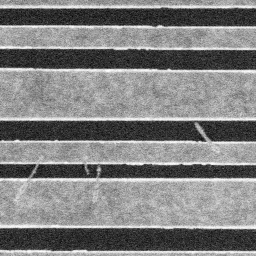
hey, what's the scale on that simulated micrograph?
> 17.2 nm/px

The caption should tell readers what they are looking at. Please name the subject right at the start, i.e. lines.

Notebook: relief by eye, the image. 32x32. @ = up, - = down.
@@@@@@@@@@@@@@@@@@@@@@@@@@@@@@@@
--------------------------------
--------------------------------
@@@@@@@@@@@@@@@@@@@@@@@@@@@@@@@@
@@@@@@@@@@@@@@@@@@@@@@@@@@@@@@@@
@@@@@@@@@@@@@@@@@@@@@@@@@@@@@@@@
--------------------------------
--------------------------------
--------------------------------
@@@@@@@@@@@@@@@@@@@@@@@@@@@@@@@@
@@@@@@@@@@@@@@@@@@@@@@@@@@@@@@@@
@@@@@@@@@@@@@@@@@@@@@@@@@@@@@@@@
@@@@@@@@@@@@@@@@@@@@@@@@@@@@@@@@
@@@@@@@@@@@@@@@@@@@@@@@@@@@@@@@@
@@@@@@@@@@@@@@@@@@@@@@@@@@@@@@@@
--------------------------------
--------------------------------
--------------------------------
@@@@@@@@@@@@@@@@@@@@@@@@@@@@@@@@
@@@@@@@@@@@@@@@@@@@@@@@@@@@@@@@@
----@-----@-----@@--@@@@-@@@@@@@
--------------------------------
@@@@@@@@-@@-@@@---@-------------
@@@@@@@@@@@@@@@@@@@@@@@@@@@@@@@@
@@@@@@@@@@@@@@@@@@@@@@@@@@@@@@@@
@@@@@@@@@@@@@@@@@@@@@@@@@@@@@@@@
@@@@@@@@@@@@@@@@@@@@@@@@@@@@@@@@
@@@@@@@@@@@@@@@@@@@@@@@@@@@@@@@@
--------------------------------
--------------------------------
--------------------------------
@@@@@@@@@@@@@@@@@@@@@@@@@@@@@@@@